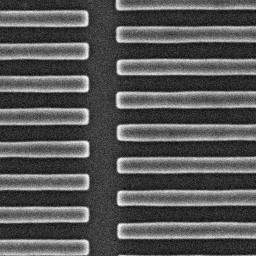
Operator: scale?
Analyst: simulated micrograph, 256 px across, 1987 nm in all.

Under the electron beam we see groups of lines, slits or small figures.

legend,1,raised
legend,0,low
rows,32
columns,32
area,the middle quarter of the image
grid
00000000000000111111111111111111
00000000000000111111111111111111
00000000000000111111111111111111
11111100000000000000000000000000
11111100000000000000000000000000
11111100000000000000000000000000
11111100000000000000000000000000
00000000000000111111111111111111
00000000000001111111111111111111
00000000000001111111111111111111
00000000000000111111111111111111
11111100000000000000000000000000
11111100000000000000000000000000
11111100000000000000000000000000
11111100000000000000000000000000
00000000000000011111111111111111
00000000000000111111111111111111
00000000000000111111111111111111
00000000000000111111111111111111
00000000000000000000000000000000
11111100000000000000000000000000
11111100000000000000000000000000
11111100000000000000000000000000
00000000000000000000001111111110
00000000000000111111111111111111
00000000000000111111111111111111
00000000000000111111111111111111
00000000000000000000000000000000
11111100000000000000000000000000
11111100000000000000000000000000
11111100000000000000000000000000
00000000000000000000000000000000